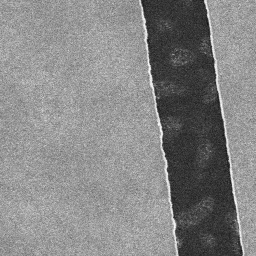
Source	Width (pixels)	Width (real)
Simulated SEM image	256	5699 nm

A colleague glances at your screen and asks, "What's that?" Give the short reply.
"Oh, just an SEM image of one or a few lines or trenches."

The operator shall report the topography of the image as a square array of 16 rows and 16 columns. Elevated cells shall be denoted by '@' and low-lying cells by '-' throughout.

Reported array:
@@@@@@@@@----@@@
@@@@@@@@@----@@@
@@@@@@@@@----@@@
@@@@@@@@@----@@@
@@@@@@@@@-----@@
@@@@@@@@@@----@@
@@@@@@@@@@----@@
@@@@@@@@@@----@@
@@@@@@@@@@----@@
@@@@@@@@@@----@@
@@@@@@@@@@----@@
@@@@@@@@@@-----@
@@@@@@@@@@@----@
@@@@@@@@@@@----@
@@@@@@@@@@@----@
@@@@@@@@@@@----@